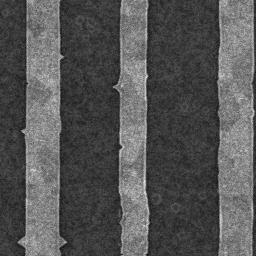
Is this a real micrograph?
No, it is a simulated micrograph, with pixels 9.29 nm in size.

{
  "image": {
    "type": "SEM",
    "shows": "one or a few lines or trenches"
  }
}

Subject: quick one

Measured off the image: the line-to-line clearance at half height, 0.59 micrometres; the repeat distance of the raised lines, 897 nm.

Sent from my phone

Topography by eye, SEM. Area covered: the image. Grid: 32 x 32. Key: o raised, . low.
...oooo........ooo.........ooooo
...oooo........ooo.........ooooo
...oooo........ooo.........ooooo
...oooo........ooo..........oooo
...oooo........ooo..........oooo
...oooo........ooo..........oooo
...ooooo.......ooo.........ooooo
...ooooo.......ooo.........ooooo
...oooo........ooo.........ooooo
...oooo........ooo.........ooooo
...oooo........ooo.........ooooo
...ooooo.......ooo.........ooooo
...oooo........ooo.........ooooo
...oooo........ooo.........ooooo
...oooo........ooo.........ooooo
...ooooo.......ooo..........ooo.
...oooo........ooo..........oooo
...oooo........ooo..........oooo
...oooo........ooo.........ooooo
...oooo........ooo.........ooooo
...oooo........ooo.........ooooo
...oooo........ooo.........ooooo
...oooo........ooo.........ooooo
...oooo........ooo.........ooooo
...oooo........ooo.........ooooo
...oooo........ooo..........oooo
...oooo........oooo.........oooo
...oooo........oooo.........oooo
...oooo........ooo..........oooo
...ooooo.......ooo..........ooo.
...ooooo.......ooo.........oooo.
...ooooo.......ooo.........oooo.